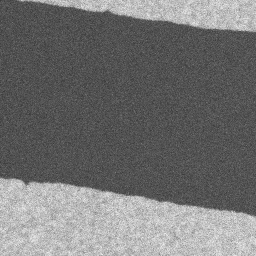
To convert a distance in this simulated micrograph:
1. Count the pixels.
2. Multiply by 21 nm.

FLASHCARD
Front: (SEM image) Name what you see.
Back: one or a few lines or trenches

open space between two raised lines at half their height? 3.77 µm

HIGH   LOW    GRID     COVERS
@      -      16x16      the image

-----@@@@@@@@@@@
-----------@@@@@
----------------
----------------
----------------
----------------
----------------
----------------
----------------
----------------
----------------
@@@@------------
@@@@@@@@@@------
@@@@@@@@@@@@@@@@
@@@@@@@@@@@@@@@@
@@@@@@@@@@@@@@@@